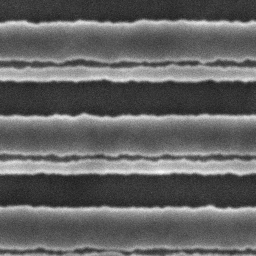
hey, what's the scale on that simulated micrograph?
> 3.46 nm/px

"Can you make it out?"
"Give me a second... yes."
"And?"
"lines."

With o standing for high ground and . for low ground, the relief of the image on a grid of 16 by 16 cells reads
................
oo.oooo.oooooooo
oooooooooooooooo
oooooooooooooooo
oooooooooooooooo
................
................
oooooooooooooooo
oooooooooooooooo
oooooooooooooooo
oooooooooooooooo
................
................
oooooooooooooooo
oooooooooooooooo
oooooooooooooooo